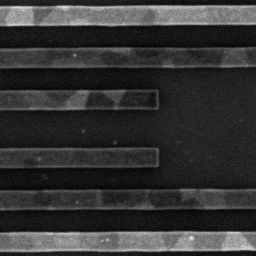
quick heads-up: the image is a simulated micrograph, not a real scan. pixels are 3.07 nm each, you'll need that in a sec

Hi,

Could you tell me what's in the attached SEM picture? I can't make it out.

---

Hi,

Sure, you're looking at wiring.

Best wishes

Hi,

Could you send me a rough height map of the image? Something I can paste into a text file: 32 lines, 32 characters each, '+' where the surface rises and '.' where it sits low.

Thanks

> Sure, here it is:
................................
++++++++++++++++++++++++++++++++
++++++++++++++++++++++++++++++++
................................
................................
................................
++++++++++++++++++++++++++++++++
++++++++++++++++++++++++++++++++
................................
................................
................................
++++++++++++++++++++............
++++++++++++++++++++............
++++++++++++++++++++............
................................
................................
................................
................................
................................
++++++++++++++++++++............
++++++++++++++++++++............
................................
................................
................................
++++++++++++++++++++++++++++++++
++++++++++++++++++++++++++++++++
................................
................................
................................
++++++++++++++++++++++++++++++++
++++++++++++++++++++++++++++++++
................................